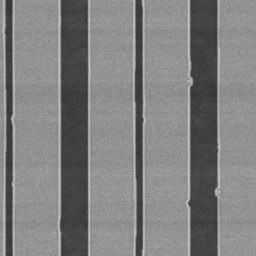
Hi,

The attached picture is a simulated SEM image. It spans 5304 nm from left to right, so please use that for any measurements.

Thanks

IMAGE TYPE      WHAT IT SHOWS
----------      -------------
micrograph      one or a few lines or trenches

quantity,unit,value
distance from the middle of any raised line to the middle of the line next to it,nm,1350